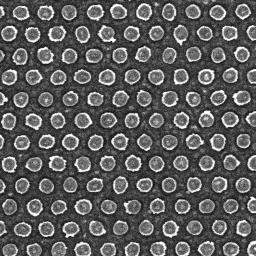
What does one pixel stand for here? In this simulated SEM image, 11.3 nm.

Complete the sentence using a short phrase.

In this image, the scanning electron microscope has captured a regular array of raised bodies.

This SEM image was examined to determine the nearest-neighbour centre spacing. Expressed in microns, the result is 0.272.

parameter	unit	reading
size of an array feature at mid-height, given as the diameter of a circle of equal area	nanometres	172